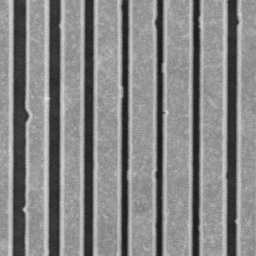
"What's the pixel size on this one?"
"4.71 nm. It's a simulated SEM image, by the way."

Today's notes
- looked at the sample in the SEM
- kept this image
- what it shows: parallel lines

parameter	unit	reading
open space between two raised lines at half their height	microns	0.0572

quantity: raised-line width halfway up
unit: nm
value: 119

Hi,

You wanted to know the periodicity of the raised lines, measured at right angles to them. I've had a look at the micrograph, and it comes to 0.166 um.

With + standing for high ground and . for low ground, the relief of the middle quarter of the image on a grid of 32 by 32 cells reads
+++++...++++++...++++++..+++++++
+++++...++++++...++++++..+++++++
+++++...++++++...++++++..+++++++
+++++...++++++...++++++..+++++++
+++++...++++++...++++++..+++++++
+++++...++++++...++++++..+++++++
+++++...++++++...++++++..+++++++
+++++...++++++...++++++..+++++++
+++++...++++++...++++++..+++++++
+++++...++++++...++++++..+++++++
+++++...++++++...++++++..+++++++
+++++...++++++...++++++..+++++++
+++++...++++++...++++++..+++++++
+++++...++++++...++++++..+++++++
+++++...++++++...++++++..+++++++
+++++...++++++...++++++..+++++++
+++++...++++++...++++++..+++++++
+++++...++++++...++++++..+++++++
+++++...++++++..+++++++..+++++++
+++++...++++++..+++++++..+++++++
+++++...++++++..+++++++..+++++++
+++++...++++++..+++++++..+++++++
+++++...++++++..+++++++..+++++++
+++++...++++++..+++++++..+++++++
+++++...++++++..+++++++..+++++++
+++++...++++++..+++++++..+++++++
+++++...++++++..+++++++..+++++++
+++++...++++++..+++++++..+++++++
+++++...++++++..+++++++..+++++++
+++++...++++++..+++++++..+++++++
+++++...++++++..+++++++..+++++++
+++++...++++++..+++++++..+++++++